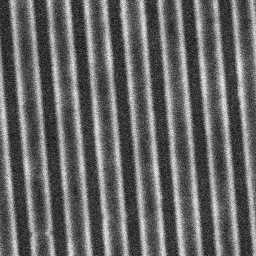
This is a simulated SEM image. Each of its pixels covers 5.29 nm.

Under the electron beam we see parallel lines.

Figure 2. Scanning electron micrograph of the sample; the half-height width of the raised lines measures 108 nanometres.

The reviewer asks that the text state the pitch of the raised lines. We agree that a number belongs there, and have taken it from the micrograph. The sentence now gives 195 nanometres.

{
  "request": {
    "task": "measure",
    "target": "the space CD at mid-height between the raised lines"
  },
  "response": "0.0857 um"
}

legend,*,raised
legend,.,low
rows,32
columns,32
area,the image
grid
.***..***..**..***..**...**..***
..**..***..**..***..***..**..***
..**..***..**..***..***..**..***
..**..***..**...**..***..**..***
..**..***..***..**..***..**..***
..**..***..***..**..***..**...**
..***..**..***..**..***..***..**
..***..**..***..**...**..***..**
..***..**..***..**...**..***..**
..***..**..***..***..**..***..**
..***..**...**..***..**..***..**
..***..***..**..***..**..***..**
..***..***..**..***..**...**..**
*.***..***..**..***..***..**..**
*..**..***..**...**..***..**..**
*..**..***..***..**..***..**..**
*..**..***..***..**..***..**..**
*..**...**..***..**..***..***..*
*..***..**..***..**..***..***..*
*..***..**..***..**...**..***..*
*..***..**..***..***..**..***..*
*..***..**..***..***..**..***..*
*..***..**...**..***..**..***..*
*..***..***..**..***..**...**..*
*...**..***..**..***..***..**..*
**..**..***..**...**..***..**..*
**..**..***..**...**..***..**..*
**..**..***..***..**..***..**..*
**..**..***..***..**..***..**...
**..**...**..***..**..***..***..
**..***..**..***..**...**..***..
**..***..**..***..***..**..***..